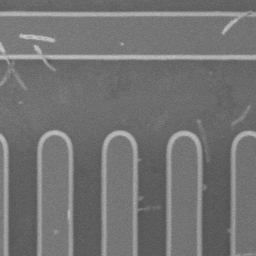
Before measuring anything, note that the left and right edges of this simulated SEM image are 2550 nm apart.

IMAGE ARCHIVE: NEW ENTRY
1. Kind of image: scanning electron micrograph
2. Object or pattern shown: groups of lines, slits or small figures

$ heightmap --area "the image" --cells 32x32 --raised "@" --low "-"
--------------------------------
--------------------------------
@@@@@@@@@@@@@@@@@@@@@@@@@@@@@@@@
@@@@@@@@@@@@@@@@@@@@@@@@@@@@@@@@
@@@@@@@@@@@@@@@@@@@@@@@@@@@@@@@@
@@@@@@@@@@@@@@@@@@@@@@@@@@@@@@@@
@@@@@@@@@@@@@@@@@@@@@@@@@@@@@@@@
--------------------------------
--------------------------------
--------------------------------
--------------------------------
--------------------------------
--------------------------------
--------------------------------
--------------------------------
--------------------------------
--------------------------------
-----@@@-----@@@------@@@-----@@
@----@@@@----@@@@----@@@@----@@@
@----@@@@----@@@@----@@@@----@@@
@----@@@@----@@@@----@@@@----@@@
@----@@@@----@@@@----@@@@----@@@
@----@@@@----@@@@----@@@@----@@@
@----@@@@----@@@@----@@@@----@@@
@----@@@@----@@@@----@@@@----@@@
@----@@@@----@@@@----@@@@----@@@
@----@@@@----@@@@----@@@@----@@@
@----@@@@----@@@@----@@@@----@@@
@----@@@@----@@@@----@@@@----@@@
@----@@@@----@@@@----@@@@----@@@
@----@@@@----@@@@----@@@@----@@@
@----@@@@----@@@@----@@@@----@@@